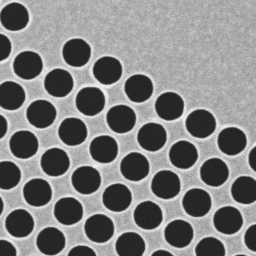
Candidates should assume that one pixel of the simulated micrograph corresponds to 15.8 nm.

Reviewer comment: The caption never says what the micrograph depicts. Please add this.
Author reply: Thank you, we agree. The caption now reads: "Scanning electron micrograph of a regular array of holes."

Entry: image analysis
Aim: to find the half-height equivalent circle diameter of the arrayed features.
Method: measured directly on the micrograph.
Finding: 465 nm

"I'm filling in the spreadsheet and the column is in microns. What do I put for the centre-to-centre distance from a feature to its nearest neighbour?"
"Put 0.558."